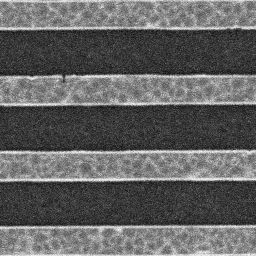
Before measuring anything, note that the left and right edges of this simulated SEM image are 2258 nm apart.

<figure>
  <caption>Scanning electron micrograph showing one or a few lines or trenches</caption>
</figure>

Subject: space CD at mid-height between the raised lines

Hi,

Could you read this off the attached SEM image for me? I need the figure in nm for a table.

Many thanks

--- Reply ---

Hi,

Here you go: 420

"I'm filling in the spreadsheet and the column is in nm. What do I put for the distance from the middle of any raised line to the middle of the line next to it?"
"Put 666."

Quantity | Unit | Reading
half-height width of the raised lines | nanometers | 240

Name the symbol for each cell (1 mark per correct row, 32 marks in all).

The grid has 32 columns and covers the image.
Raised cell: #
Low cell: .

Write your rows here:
################################
################################
################################
########.............########...
................................
................................
................................
................................
................................
................................
################################
################################
################################
................................
................................
................................
................................
................................
................................
################################
################################
################################
................................
................................
................................
................................
................................
................................
.###############################
################################
################################
################################